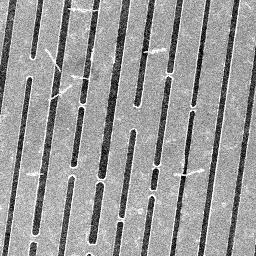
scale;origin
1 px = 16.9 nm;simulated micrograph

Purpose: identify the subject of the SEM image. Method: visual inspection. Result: parallel lines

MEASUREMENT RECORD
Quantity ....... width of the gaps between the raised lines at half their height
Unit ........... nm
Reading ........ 111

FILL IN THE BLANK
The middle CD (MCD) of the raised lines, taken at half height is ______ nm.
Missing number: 358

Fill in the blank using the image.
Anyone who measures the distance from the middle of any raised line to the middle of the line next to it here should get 469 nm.